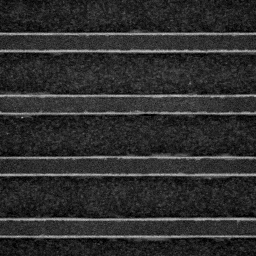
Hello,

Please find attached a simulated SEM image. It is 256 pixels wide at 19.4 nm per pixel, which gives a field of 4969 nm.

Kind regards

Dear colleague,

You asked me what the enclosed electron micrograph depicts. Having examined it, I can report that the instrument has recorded parallel lines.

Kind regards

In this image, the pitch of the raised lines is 1200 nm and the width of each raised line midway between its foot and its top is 340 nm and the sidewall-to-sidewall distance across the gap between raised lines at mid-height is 0.861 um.